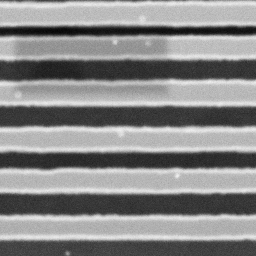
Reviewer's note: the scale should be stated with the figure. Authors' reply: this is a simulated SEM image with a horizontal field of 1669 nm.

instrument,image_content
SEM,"lines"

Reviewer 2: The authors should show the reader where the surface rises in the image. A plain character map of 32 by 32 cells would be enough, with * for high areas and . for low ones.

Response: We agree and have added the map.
********************************
********************************
********************************
................................
.................***..***......*
********************************
********************************
................................
................................
................................
********************************
********************************
********************************
................................
................................
................................
********************************
********************************
********************************
................................
................................
********************************
********************************
********************************
................................
................................
................................
********************************
********************************
********************************
................................
................................